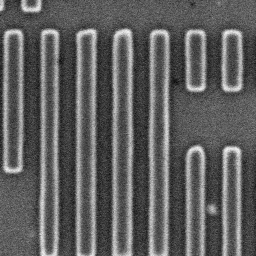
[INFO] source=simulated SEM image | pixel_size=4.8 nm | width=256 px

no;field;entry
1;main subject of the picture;wiring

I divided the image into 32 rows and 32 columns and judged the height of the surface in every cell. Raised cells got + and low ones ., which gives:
...++...........................
................................
................................
................................
.++..++...++..++...++..+++..++..
.++..++...++..++...++..+++..++..
.++..++...++..++...++..+++..++..
.++..++...++..++...++..+++..++..
.++..++...++..++...++..+++..++..
.++..++...++..++...++..+++..++..
.++..++...++..++...++..+++..++..
.++..++...++..++...++...........
.++..++...++..++...++...........
.++..++...++..++...++...........
.++..++...++..++...++...........
.++..++...++..++...++...........
.++..++...++..++...++...........
.++..++...++..++...++...........
.++..++...++..++...++...+...++..
.++..++...++..++...++..++...++..
.++..++...++..++...++..++...++..
.....++...++..++...++..++...++..
.....++...++..++...++..++...++..
.....++...++..++...++..++...++..
.....++...++..++...++..++...++..
.....++...++..++...++..++...++..
.....++...++..++...++..++...++..
.....++...++..++...++..++...++..
.....++...++..++...++..++...++..
.....++...++..++...++..++...++..
.....++...++..++...++..++...++..
.....++...++..++...++..++...++..